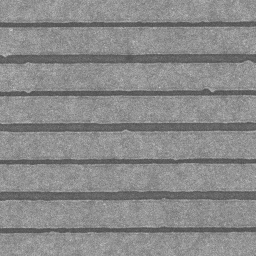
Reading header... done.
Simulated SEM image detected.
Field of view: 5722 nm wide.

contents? parallel lines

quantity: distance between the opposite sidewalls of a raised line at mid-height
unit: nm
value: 606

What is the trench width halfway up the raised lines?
0.134 µm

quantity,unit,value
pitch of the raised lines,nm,774